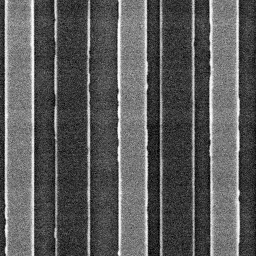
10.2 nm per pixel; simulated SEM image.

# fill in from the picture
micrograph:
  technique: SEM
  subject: lines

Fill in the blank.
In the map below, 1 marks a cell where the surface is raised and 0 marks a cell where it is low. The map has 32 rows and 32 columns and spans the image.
01110001111000011100111100111100
01110001111000011100111100111100
01110001111000011100111100111100
01110001111000011100111100111100
01110001111000011100111100111100
01110001111000011100111100111100
01110001111000011100111100111100
01110001111000011100111100111100
01110001111000011100111100111100
01110001111000011100111100111100
01110001111000011100111100111100
01110001111000011100111100111100
01110001111000011100111100111100
01110001111000011100111100111100
01110001111000011100111100111100
01110001111000011100111100111100
01110001111000011100111100111100
01110001111000011100111100111100
01110001111000011100111100111100
01110001111000011100111100111100
01110001111000011100111100111100
01110001111000011100111100111100
01110001111000011100111100111100
01110001111000011100111100111100
01110001111000011100111100111100
01110001111000011100111100111100
01110001111000011100111100111100
01110001111000011100111100111100
01110001111000011100111100111100
01110001111000011100111100111100
01110001111000011100111100111100
01110001111000011100111100111100